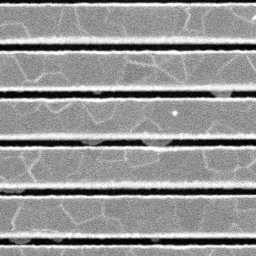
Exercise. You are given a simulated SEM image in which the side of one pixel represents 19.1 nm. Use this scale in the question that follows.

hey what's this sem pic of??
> lines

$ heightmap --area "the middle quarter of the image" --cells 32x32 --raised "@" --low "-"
@@@@@@@@@@@@@@@@@@@@@@@@@@@@@@@@
@@@@@@@@@@@@@@@@@@@@@@@@@@@@@@@@
@@@@@@@@@@@@@@@@@@@@@@@@@@@@@@@@
@@@@@@@@@@@@@@@@@@@@@@@@@@@@@@@@
@@@@@@@@@@@@@@@@@@@@@@@@@@@@@@@@
@@@@@@@@@@@@@@@@@@@@@@@@@@@@@@@@
@@@@@@-@@@@@@--@-----@-@--------
--------------------------------
--------------------------------
@@@@@@@@@@@@@@@@@@@@@@@@@@@@@@@@
@@@@@@@@@@@@@@@@@@@@@@@@@@@@@@@@
@@@@@@@@@@@@@@@@@@@@@@@@@@@@@@@@
@@@@@@@@@@@@@@@@@@@@@@@@@@@@@@@@
@@@@@@@@@@@@@@@@@@@@@@@@@@@@@@@@
@@@@@@@@@@@@@@@@@@@@@@@@@@@@@@@@
@@@@@@@@@@@@@@@@@@@@@@@@@@@@@@@@
@@@@@@@@@@@@@@@@@@@@@@@@@@@@@@@@
@@@@@@@@@@@@@@@@@@@@@@@@@@@@@@@@
@@@@@@@@@@@@@@@@@@-@@@@@@@@@@@@@
--------------------------------
--------------------------------
@@@@@@@@@@@@@@@@@@@@@@@@@@@@@@@@
@@@@@@@@@@@@@@@@@@@@@@@@@@@@@@@@
@@@@@@@@@@@@@@@@@@@@@@@@@@@@@@@@
@@@@@@@@@@@@@@@@@@@@@@@@@@@@@@@@
@@@@@@@@@@@@@@@@@@@@@@@@@@@@@@@@
@@@@@@@@@@@@@@@@@@@@@@@@@@@@@@@@
@@@@@@@@@@@@@@@@@@@@@@@@@@@@@@@@
@@@@@@@@@@@@@@@@@@@@@@@@@@@@@@@@
@@@@@@@@@@@@@@@@@@@@@@@@@@@@@@@@
@@@@@@@@@@@@@@@@@@@@@@@@@@@@@@@@
--------------------------------